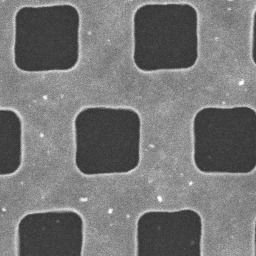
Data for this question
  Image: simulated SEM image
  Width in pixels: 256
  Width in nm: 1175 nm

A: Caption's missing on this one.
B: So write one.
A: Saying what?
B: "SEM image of holes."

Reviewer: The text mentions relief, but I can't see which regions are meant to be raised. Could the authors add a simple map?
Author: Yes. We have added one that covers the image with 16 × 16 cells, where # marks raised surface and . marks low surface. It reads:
##...####...####
#....###....####
#....###....####
#....###....####
################
################
################
.####....###....
.####....###....
.####....###....
.####...####....
################
################
##...####...####
#....####....###
#....####....###